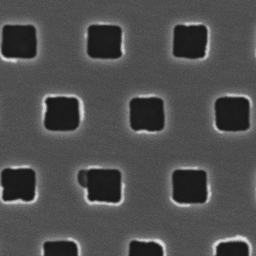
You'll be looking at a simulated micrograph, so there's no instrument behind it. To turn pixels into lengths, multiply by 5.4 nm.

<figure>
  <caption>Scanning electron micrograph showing a regular array of holes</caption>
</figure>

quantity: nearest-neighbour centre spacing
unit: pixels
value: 83.5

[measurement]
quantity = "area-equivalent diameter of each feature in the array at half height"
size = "0.201 micrometres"